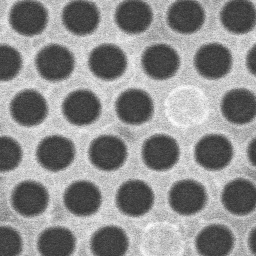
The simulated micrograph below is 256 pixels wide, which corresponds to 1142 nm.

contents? a regular array of holes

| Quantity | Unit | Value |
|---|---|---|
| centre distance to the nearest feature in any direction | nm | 233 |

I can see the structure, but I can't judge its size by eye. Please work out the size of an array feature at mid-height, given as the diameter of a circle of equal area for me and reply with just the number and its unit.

163 nanometers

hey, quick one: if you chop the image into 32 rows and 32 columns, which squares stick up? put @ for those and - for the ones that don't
@@---@@@@---@@@---@@@@---@@@---@
@-----@@----@@-----@@----@@@----
@-----@@----@@-----@@----@@@----
@@---@@@----@@@---@@@----@@@----
@@@@@@@@@@@@@@@@@@@@@@@@@@@@@@@@
@@@@@@@@@@@@@@@@@@@@@@@@@@-@@@@@
--@@@----@@----@@@----@@@----@@-
---@-----@@-----@@----@@-----@@-
---@@----@@-----@@----@@-----@@-
--@@@----@@@---@@@@--@@@@---@@@@
@@@@@@@@@@@@@@@@@@@@@@@@@@@@@@@@
@@@--@@@@--@@@@@--@@@@@@@@@@@--@
@@----@@----@@@----@@@@@@@@@----
@-----@@-----@-----@@@@@@@@@----
@@----@@----@@@----@@@@@@@@@----
@@---@@@@--@@@@@-@@@@@@@@@@@@--@
@@@@@@@@@@@@@@@@@@@@@@@@@@@@@@@@
--@@@----@@@---@@@----@@@---@@@@
--@@@----@@-----@@----@@-----@@-
---@@----@@-----@@----@@-----@@-
--@@@----@@@---@@@----@@@---@@@@
@@@@@@@@@@@@@@@@@@@@@@@@@@@@@@@@
@@@@@@@@@@@@@@@@@@@@@@@-@@@@@--@
@@----@@@---@@@----@@----@@@----
@@----@@-----@@----@@-----@@----
@@----@@-----@@----@@-----@@----
@@---@@@@---@@@---@@@@---@@@@--@
@@@@@@@@@@@@@@@@@@@@@@@@@@@@@@@@
-@@@@@@-@@@@@--@@@@@@@@@@@--@@@@
--@@@----@@@----@@@@@@@@@----@@-
---@@----@@-----@@@@@@@@-----@@-
---@@----@@@----@@@@@@@@@----@@-